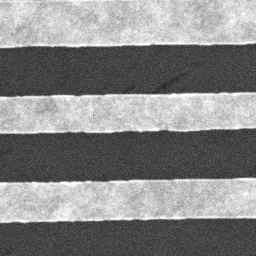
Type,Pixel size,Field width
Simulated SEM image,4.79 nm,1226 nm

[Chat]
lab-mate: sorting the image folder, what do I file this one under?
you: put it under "lines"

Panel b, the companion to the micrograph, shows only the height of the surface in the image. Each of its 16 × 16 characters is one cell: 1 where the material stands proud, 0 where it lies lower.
1111111111111111
1111111111111111
1111111111111111
0000000000000000
0000000000000000
0000000000000000
1111111111111111
1111111111111111
0000000000000000
0000000000000000
0000000000000000
1111111111111111
1111111111111111
1111111111111111
0000000000000000
0000000000000000